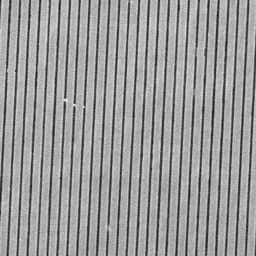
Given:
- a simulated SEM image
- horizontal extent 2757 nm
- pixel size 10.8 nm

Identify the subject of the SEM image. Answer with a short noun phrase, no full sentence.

parallel lines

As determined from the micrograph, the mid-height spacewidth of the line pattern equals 28.2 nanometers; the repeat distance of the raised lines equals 107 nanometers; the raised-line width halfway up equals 7.11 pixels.